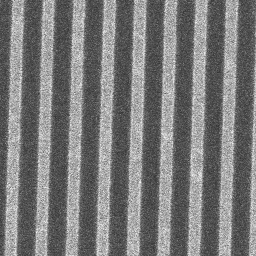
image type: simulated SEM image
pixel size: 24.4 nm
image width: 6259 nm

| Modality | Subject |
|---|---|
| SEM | parallel lines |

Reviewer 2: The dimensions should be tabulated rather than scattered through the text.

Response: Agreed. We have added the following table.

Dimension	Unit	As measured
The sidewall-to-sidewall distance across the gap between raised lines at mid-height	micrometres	0.412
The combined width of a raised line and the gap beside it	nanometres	747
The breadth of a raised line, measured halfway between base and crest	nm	342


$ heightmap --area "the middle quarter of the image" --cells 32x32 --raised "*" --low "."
..***....****....***.....***....
..***....****....***.....***....
..***....****....***.....***....
..***....****....***....****....
..***....***.....***....****....
..***....***.....***....****....
..***....***.....***....****....
..***....***.....***....****....
.****....***.....***....****....
.****....***.....***....****....
.****....***.....***....****....
.****....***.....***....****....
.***.....***.....***....***.....
.***.....***.....***....***.....
.***.....***.....***....***.....
.***.....***.....***....***.....
.***.....***.....***....***.....
.***.....***.....***....***.....
.***.....***.....***....***.....
.***.....***....****....***.....
.***.....***....****....***.....
.***.....***....****....***.....
.***.....***....****....***.....
.***.....***....****....***.....
.***.....***....****....***.....
.***.....***....****....***.....
.***.....***....****....***.....
.***.....***....****....***....*
.***....****....****....***....*
.***....****....***.....***....*
.***....****....***.....***....*
.***....***.....***.....***....*